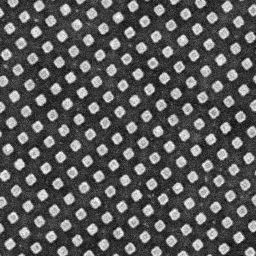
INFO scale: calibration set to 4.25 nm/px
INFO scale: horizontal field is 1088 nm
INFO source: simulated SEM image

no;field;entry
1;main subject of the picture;a regular array of raised bodies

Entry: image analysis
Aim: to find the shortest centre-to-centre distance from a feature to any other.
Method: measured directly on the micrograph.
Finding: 78.3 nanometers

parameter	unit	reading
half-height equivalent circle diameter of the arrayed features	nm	42